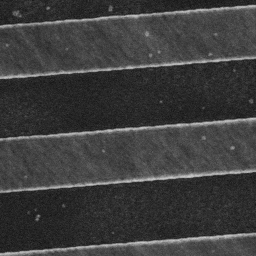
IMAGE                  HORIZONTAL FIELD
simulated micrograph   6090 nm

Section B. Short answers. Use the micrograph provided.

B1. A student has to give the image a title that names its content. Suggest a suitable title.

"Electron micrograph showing lines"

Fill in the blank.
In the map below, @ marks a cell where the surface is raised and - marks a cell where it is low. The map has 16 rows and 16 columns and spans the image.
--------------@@
--@@@@@@@@@@@@@@
@@@@@@@@@@@@@@@@
@@@@@@@@@@@@@@@@
@@@@@-----------
----------------
----------------
---------------@
---@@@@@@@@@@@@@
@@@@@@@@@@@@@@@@
@@@@@@@@@@@@@@@@
@@@@@@@---------
----------------
----------------
----------------
----@@@@@@@@@@@@